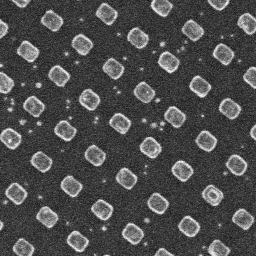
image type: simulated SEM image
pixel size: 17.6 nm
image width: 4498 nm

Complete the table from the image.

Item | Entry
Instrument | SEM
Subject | a regular array of raised bodies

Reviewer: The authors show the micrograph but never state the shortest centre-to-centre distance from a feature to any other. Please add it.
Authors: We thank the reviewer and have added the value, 682 nm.